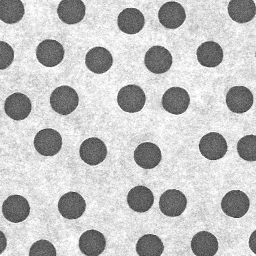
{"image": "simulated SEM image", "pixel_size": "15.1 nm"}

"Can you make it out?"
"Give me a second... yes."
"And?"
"a regular array of holes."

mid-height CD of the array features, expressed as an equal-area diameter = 425 nm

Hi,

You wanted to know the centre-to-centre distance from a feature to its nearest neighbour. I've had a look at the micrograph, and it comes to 690 nanometers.